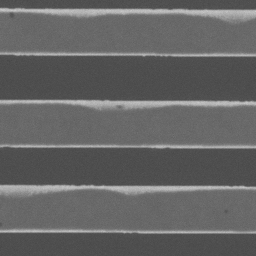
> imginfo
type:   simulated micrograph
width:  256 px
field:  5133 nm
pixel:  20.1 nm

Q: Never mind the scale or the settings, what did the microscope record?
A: lines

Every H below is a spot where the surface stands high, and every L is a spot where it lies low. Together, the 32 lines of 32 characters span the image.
LLLLLLLLLLLLLLLLLLLLLLLLLLLLLLLL
HHHHHHHHHHHHHHHHHHHHHHHHHHHLLLLL
HHHHHHHHHHHHHHHHHHHHHHHHHHHHHHHH
HHHHHHHHHHHHHHHHHHHHHHHHHHHHHHHH
HHHHHHHHHHHHHHHHHHHHHHHHHHHHHHHH
HHHHHHHHHHHHHHHHHHHHHHHHHHHHHHHH
HHHHHHHHHHHHHHHHHHHHHHHHHHHHHHHH
LLLLLLLLLLLLLLLLLLLLLLLLLLLLLLLL
LLLLLLLLLLLLLLLLLLLLLLLLLLLLLLLL
LLLLLLLLLLLLLLLLLLLLLLLLLLLLLLLL
LLLLLLLLLLLLLLLLLLLLLLLLLLLLLLLL
LLLLLLLLLLLLLLLLLLLLLLLLLLLLLLLL
LLLLLLLLLLLLLLLLLLLLLLLLLLLLLLLL
HHHHHHHHHHHHHHHHHHHHHHHHHHHHHHHH
HHHHHHHHHHHHHHHHHHHHHHHHHHHHHHHH
HHHHHHHHHHHHHHHHHHHHHHHHHHHHHHHH
HHHHHHHHHHHHHHHHHHHHHHHHHHHHHHHH
HHHHHHHHHHHHHHHHHHHHHHHHHHHHHHHH
LLLLLLLLLLLLLLLLLLLLLLLLLLLLLLLL
LLLLLLLLLLLLLLLLLLLLLLLLLLLLLLLL
LLLLLLLLLLLLLLLLLLLLLLLLLLLLLLLL
LLLLLLLLLLLLLLLLLLLLLLLLLLLLLLLL
LLLLLLLLLLLLLLLLLLLLLLLLLLLLLLLL
LLLLHHHHHHHHHHHHLLHHHHHHHHHHHHHH
HHHHHHHHHHHHHHHHHHHHHHHHHHHHHHHH
HHHHHHHHHHHHHHHHHHHHHHHHHHHHHHHH
HHHHHHHHHHHHHHHHHHHHHHHHHHHHHHHH
HHHHHHHHHHHHHHHHHHHHHHHHHHHHHHHH
HHHHHHHHHHHHHHHHHHHHHHHHHHHHHHHH
LLLLLLLLLLLLLLLLLLLLLLLLLLLLLLLL
LLLLLLLLLLLLLLLLLLLLLLLLLLLLLLLL
LLLLLLLLLLLLLLLLLLLLLLLLLLLLLLLL